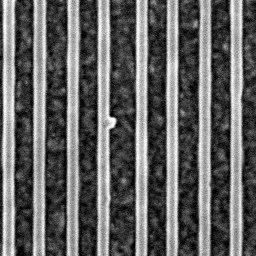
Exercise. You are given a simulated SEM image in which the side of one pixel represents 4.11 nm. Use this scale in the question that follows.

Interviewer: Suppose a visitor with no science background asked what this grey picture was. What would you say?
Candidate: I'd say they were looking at parallel lines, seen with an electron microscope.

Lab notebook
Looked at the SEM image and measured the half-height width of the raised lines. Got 41.1 nanometers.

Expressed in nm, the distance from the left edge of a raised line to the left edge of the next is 134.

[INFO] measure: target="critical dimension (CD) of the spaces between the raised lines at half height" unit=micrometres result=0.0899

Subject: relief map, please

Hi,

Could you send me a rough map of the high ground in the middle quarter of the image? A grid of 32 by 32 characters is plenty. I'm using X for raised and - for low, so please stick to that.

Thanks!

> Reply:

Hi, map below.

-XX------XX-------XXX-----XX----
-XX------XX-------XXX-----XX----
-XX------XX-------XXX-----XX----
-XX------XX-------XX------XX----
-XX------XX-------XX------XX----
-XX------XX-------XX------XX----
-XX------XX-------XX------XX----
-XX------XX-------XX------XX----
-XX------XX-------XX------XX----
-XX------XX-------XX------XX----
-XX------XX-------XX------XX----
-XX------XX-------XX------XX----
-XX------XX-------XXX-----XX----
-XX------XXX------XXX-----XX----
-XX------XXXX-----XXX-----XX----
-XX------XXX------XXX-----XX----
-XX------XX-------XXX-----XX----
-XX------XX-------XXX-----XX----
-XX------XX-------XXX-----XX----
-XX------XX-------XXX-----XX----
-XX------XX-------XXX-----XX----
-XX------XX-------XX------XX----
-XX------XX-------XX------XX----
-XX------XX-------XX------XX----
-XX------XX-------XXX-----XX----
-XX------XX-------XXX-----XX----
-XX------XX-------XXX-----XX----
-XX------XX-------XXX-----XX----
-XX------XX-------XXX-----XX----
-XX------XX-------XXX-----XX----
-XX------XX-------XXX-----XX----
-XX------XX-------XXX-----XX----